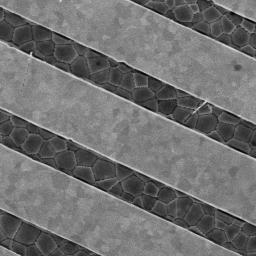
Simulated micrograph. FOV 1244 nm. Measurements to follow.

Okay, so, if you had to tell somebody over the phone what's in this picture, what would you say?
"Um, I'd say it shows one or a few lines or trenches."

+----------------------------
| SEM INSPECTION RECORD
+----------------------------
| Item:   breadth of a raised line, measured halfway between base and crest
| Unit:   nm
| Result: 286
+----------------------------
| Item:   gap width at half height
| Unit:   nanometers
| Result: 162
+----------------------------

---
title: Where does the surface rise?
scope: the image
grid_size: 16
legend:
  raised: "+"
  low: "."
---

+++++++++.....++
..+++++++++.....
.....++++++++...
++.....+++++++++
++++.....+++++++
++++++.....+++++
++++++++.....+++
..+++++++++.....
....+++++++++...
+.....+++++++++.
+++.....++++++++
+++++.....++++++
++++++++....++++
.+++++++++.....+
...+++++++++....
.....+++++++++..